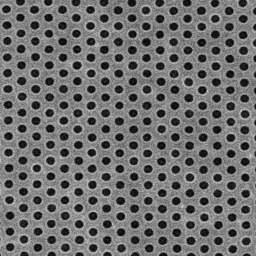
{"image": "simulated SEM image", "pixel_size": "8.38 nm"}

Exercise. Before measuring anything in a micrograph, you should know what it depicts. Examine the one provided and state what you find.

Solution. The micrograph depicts a regular array of holes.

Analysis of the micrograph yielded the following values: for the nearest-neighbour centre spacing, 131 nanometres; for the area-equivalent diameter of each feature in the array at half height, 9.24 px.